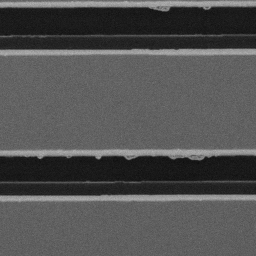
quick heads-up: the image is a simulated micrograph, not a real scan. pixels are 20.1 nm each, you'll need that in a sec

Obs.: lines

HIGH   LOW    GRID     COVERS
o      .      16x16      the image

................
................
................
oooooooooooooooo
oooooooooooooooo
oooooooooooooooo
oooooooooooooooo
oooooooooooooooo
oooooooooooooooo
oooooooooooooooo
................
................
oooooooooooooooo
oooooooooooooooo
oooooooooooooooo
oooooooooooooooo